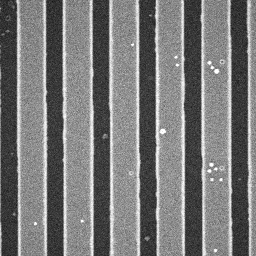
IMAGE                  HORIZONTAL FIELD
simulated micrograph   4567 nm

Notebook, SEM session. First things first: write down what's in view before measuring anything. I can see lines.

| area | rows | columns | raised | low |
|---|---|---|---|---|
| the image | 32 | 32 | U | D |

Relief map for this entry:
DDUUUUDDUUUDDDUUUDDDUUUDDUUUUDDU
DDUUUUDDUUUDDDUUUDDDUUUDDUUUUDDU
DDUUUUDDUUUDDDUUUDDDUUUDDUUUUDDU
DDUUUUDDUUUDDDUUUDDDUUUDDUUUUDDU
DDUUUUDDUUUDDDUUUDDDUUUDDUUUUDDU
DDUUUUDDUUUDDDUUUDDDUUUDDUUUUDDU
DDUUUUDDUUUDDDUUUDDDUUUDDUUUUDDU
DDUUUUDDUUUDDDUUUDDDUUUDDUUUUDDU
DDUUUUDDUUUDDDUUUDDDUUUDDUUUUDDU
DDUUUUDDUUUDDDUUUDDDUUUDDUUUUDDU
DDUUUUDDUUUDDDUUUDDDUUUDDUUUUDDU
DDUUUUDDUUUDDDUUUDDDUUUDDUUUUDDU
DDUUUUDDUUUDDDUUUDDDUUUDDUUUUDDU
DDUUUUDDUUUUDDUUUDDDUUUDDUUUUDDU
DDUUUUDDUUUUDDUUUDDDUUUDDUUUUDDU
DDUUUUDDUUUUDDUUUDDDUUUDDUUUUDDU
DDUUUUDDUUUUDDUUUDDDUUUDDUUUUDDU
DDUUUUDDUUUUDDUUUDDDUUUDDUUUUDDU
DDUUUUDDUUUDDDUUUDDDUUUDDUUUUDDU
DDUUUUDDUUUUDDUUUDDDUUUDDUUUUDDU
DDUUUUDDUUUUDDUUUDDDUUUDDUUUUDDU
DDUUUUDDUUUDDDUUUDDDUUUDDUUUUDDU
DDUUUUDDUUUUDDUUUDDDUUUDDUUUUDDU
DDUUUUDDUUUUDDUUUDDDUUUDDUUUUDDU
DDUUUUDDUUUUDDUUUDDDUUUDDUUUUDDU
DDUUUUDDUUUUDDUUUDDDUUUDDUUUUDDU
DDUUUUDDUUUUDDUUUDDDUUUDDUUUUDDU
DDUUUUDDUUUUDDUUUDDDUUUDDUUUUDDU
DDUUUUDDUUUUDDUUUDDDUUUDDUUUUDDU
DDUUUUDDUUUUDDUUUDDDUUUDDUUUUDDU
DDUUUUDDUUUUDDUUUDDDUUUDDUUUUDDU
DDUUUUDDUUUUDDUUUDDDUUUDDUUUUDDU